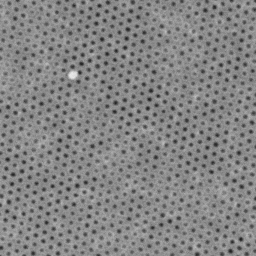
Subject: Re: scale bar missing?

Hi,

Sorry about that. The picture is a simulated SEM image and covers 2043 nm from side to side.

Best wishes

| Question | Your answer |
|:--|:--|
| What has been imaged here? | a regular array of holes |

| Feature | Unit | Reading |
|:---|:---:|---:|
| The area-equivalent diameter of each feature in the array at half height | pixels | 5.18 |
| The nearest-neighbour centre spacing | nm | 71.6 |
